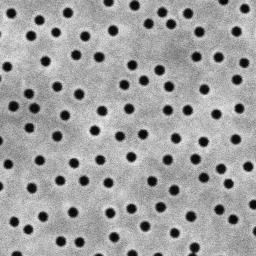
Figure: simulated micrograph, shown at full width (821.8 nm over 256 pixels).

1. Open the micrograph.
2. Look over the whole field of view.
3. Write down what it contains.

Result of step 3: a regular array of holes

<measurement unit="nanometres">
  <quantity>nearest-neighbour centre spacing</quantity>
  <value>69.2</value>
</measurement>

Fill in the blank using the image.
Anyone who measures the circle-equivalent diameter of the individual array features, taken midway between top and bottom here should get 34.4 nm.